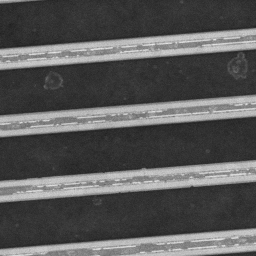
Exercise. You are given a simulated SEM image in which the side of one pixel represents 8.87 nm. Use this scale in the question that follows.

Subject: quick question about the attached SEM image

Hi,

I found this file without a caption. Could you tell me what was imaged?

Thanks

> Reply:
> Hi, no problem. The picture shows one or a few lines or trenches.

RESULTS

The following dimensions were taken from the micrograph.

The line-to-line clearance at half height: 53.7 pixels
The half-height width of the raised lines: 119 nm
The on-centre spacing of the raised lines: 0.588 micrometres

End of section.